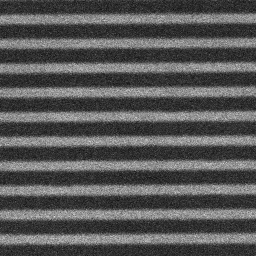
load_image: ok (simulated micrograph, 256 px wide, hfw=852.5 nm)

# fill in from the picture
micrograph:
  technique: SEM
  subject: parallel lines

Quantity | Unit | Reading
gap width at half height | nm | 54.9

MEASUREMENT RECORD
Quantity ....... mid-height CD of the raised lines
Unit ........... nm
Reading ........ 26.2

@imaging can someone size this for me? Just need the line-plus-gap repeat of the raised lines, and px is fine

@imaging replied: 24.4